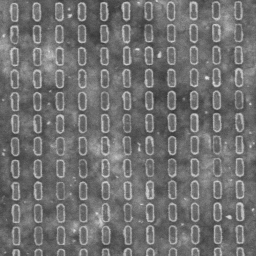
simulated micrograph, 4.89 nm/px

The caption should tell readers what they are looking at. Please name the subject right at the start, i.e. a regular array of raised bodies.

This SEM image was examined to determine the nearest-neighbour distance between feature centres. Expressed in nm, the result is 107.